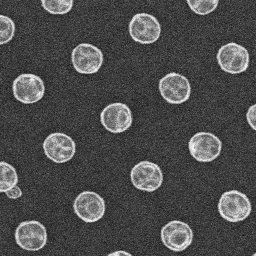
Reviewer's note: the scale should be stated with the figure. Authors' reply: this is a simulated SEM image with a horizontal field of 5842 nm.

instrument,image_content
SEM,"a regular array of raised bodies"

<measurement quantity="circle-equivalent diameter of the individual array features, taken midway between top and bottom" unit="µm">0.673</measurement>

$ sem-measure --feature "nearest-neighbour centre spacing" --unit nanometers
1490